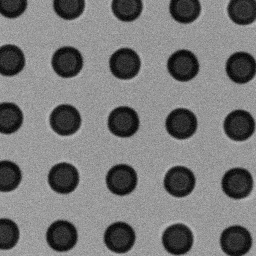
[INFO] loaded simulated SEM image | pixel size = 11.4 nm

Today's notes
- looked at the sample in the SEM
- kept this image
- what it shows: an array of small figures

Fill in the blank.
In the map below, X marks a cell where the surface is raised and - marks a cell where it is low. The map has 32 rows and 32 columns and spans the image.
---XXXX----XXX----XXX----XXX----
---XXXX----XXX----XXX----XXX----
XXXXXXXX-XXXXXX--XXXXX---XXXX---
XXXXXXXXXXXXXXXXXXXXXXXXXXXXXXXX
XXXXXXXXXXXXXXXXXXXXXXXXXXXXXXXX
X-XXXXXXXXXXXXXXXXXXXXXXXXXXXXXX
---XXXX---XXXX---XXXXX--XXXXXXXX
---XXX----XXXX----XXX----XXX----
---XXX----XXXX----XXX----XXX----
X-XXXXX---XXXX---XXXX---XXXXX---
XXXXXXXXXXXXXXXXXXXXXXXXXXXXXXXX
XXXXXXXXXXXXXXXXXXXXXXXXXXXXXXXX
XXXXXXXXXXXXXXXXXXXXXXXXXXXXXXXX
---XXXX---XXXX--XXXXXX-XXXXXXXXX
---XXX----XXX----XXXX----XXX----
---XXX----XXX----XXXX----XXX----
--XXXXX---XXXX---XXXX---XXXX----
XXXXXXXXXXXXXXXXXXXXXX-XXXXXX--X
XXXXXXXXXXXXXXXXXXXXXXXXXXXXXXXX
XXXXXXXXXXXXXXXXXXXXXXXXXXXXXXXX
--XXXXX--XXXXXXXXXXXXXXXXXXXXXXX
---XXX----XXX----XXXX---XXXX---X
---XXX----XXX----XXX----XXXX----
--XXXX----XXX----XXXX---XXXX----
XXXXXXXXXXXXXXXXXXXXX--XXXXX---X
XXXXXXXXXXXXXXXXXXXXXXXXXXXXXXXX
XXXXXXXXXXXXXXXXXXXXXXXXXXXXXXXX
-XXXXXX-XXXXXXXXXXXXXXXXXXXXXXXX
--XXXX---XXXX---XXXXX---XXXX---X
--XXXX----XXX----XXX----XXXX---X
--XXXX---XXXX----XXX----XXX----X
XXXXXXXXXXXXXX--XXXXX--XXXXX---X